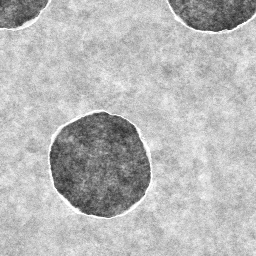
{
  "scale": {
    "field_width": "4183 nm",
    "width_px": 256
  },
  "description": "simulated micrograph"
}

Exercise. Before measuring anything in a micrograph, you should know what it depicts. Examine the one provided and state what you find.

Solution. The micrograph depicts holes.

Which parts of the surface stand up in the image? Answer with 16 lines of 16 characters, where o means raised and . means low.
...oooooooo.....
..oooooooooo...o
oooooooooooooooo
oooooooooooooooo
oooooooooooooooo
oooooooooooooooo
oooooooooooooooo
ooooo...oooooooo
ooo......ooooooo
ooo......ooooooo
ooo......ooooooo
ooo......ooooooo
oooo.....ooooooo
oooooo.ooooooooo
oooooooooooooooo
oooooooooooooooo